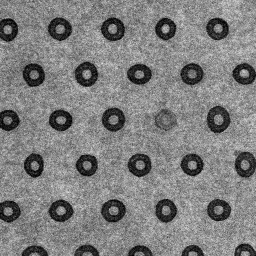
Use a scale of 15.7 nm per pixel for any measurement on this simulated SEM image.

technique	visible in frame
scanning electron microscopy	a regular array of ring-shaped grooves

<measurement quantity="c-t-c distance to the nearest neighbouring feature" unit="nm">816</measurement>